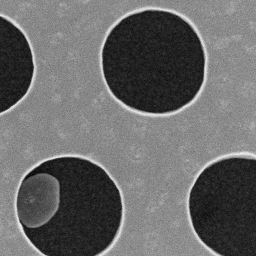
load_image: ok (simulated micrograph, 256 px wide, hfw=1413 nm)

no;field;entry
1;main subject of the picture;holes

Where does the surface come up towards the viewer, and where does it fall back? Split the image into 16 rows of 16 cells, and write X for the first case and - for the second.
XXXXXXXXXXXXXXXX
-XXXXXX-----XXXX
--XXXXX-----XXXX
--XXXX-------XXX
--XXXX-------XXX
--XXXXX------XXX
-XXXXXXX----XXXX
XXXXXXXXXXXXXXXX
XXXXXXXXXXXXXXXX
XXXXXXXXXXXXXXXX
XX----XXXXXXX---
X------XXXXX----
X-------XXXX----
X-------XXXX----
XX-----XXXXX----
XX-----XXXXXX---